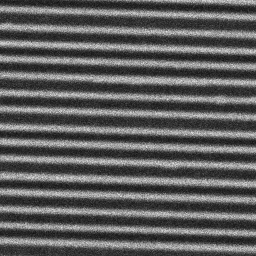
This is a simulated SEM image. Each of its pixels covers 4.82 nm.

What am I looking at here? parallel lines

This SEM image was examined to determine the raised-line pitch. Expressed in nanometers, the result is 79.8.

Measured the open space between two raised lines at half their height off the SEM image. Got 9.13 px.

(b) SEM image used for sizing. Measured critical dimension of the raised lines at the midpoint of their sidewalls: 34.9 nm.